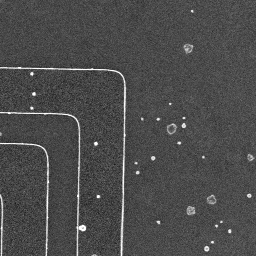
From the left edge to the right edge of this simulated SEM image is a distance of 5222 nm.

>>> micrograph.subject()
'groups of lines, slits or small figures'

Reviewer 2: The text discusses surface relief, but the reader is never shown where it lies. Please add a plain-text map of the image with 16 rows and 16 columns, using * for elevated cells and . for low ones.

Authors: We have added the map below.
................
................
................
................
*******.........
********........
********........
.....***........
.....***........
***..***........
***..***........
***..***........
***..***........
***..***........
***..***........
***..***........